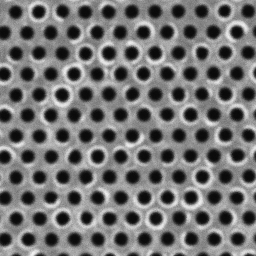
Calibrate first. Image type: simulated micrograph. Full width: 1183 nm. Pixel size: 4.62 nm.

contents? a regular array of holes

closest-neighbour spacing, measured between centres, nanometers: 107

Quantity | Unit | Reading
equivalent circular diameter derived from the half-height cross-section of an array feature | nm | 64.1